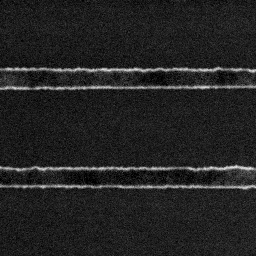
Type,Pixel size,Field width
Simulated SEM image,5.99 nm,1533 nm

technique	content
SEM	lines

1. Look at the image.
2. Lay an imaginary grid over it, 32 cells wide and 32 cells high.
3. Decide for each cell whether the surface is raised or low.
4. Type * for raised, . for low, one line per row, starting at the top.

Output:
................................
................................
................................
................................
................................
................................
................................
................................
................................
********************************
********************************
................................
................................
................................
................................
................................
................................
................................
................................
................................
................................
********************************
********************************
..............................*.
................................
................................
................................
................................
................................
................................
................................
................................